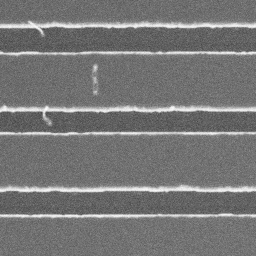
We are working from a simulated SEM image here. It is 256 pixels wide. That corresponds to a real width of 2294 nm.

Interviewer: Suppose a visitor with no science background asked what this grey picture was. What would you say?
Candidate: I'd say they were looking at lines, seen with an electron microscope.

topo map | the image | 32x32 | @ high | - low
@@@@@@@@@@@@@@@@@@@@@@@@@@@@@@@@
@@@@@@@@@@@@@@@@@@@@@@@@@@@@@@@@
@@@@@@@@@@@@@@@@@@@@@@@@@@@@@@@@
----@---------------------------
--------------------------------
--------------------------------
--------------------------------
@@@@@@@@@@@@@@@@@@@@@@@@@@@@@@@@
@@@@@@@@@@@@@@@@@@@@@@@@@@@@@@@@
@@@@@@@@@@@@@@@@@@@@@@@@@@@@@@@@
@@@@@@@@@@@@@@@@@@@@@@@@@@@@@@@@
@@@@@@@@@@@@@@@@@@@@@@@@@@@@@@@@
@@@@@@@@@@@@@@@@@@@@@@@@@@@@@@@@
@@@@@@@@@@@@@@@@@@@@@@@@@@@@@@@@
--------------------------------
--------------------------------
--------------------------------
@@@@@@@@@@@@@@@@@@@@@@@@@@@@@@@@
@@@@@@@@@@@@@@@@@@@@@@@@@@@@@@@@
@@@@@@@@@@@@@@@@@@@@@@@@@@@@@@@@
@@@@@@@@@@@@@@@@@@@@@@@@@@@@@@@@
@@@@@@@@@@@@@@@@@@@@@@@@@@@@@@@@
@@@@@@@@@@@@@@@@@@@@@@@@@@@@@@@@
@@@@@@@@@@@@@@@@@@@@@@@@@@@@@@@@
--------------------------------
--------------------------------
--------------------------------
@@@@@@@@@@@@@@@@@@@@@@@@@@@@@@@@
@@@@@@@@@@@@@@@@@@@@@@@@@@@@@@@@
@@@@@@@@@@@@@@@@@@@@@@@@@@@@@@@@
@@@@@@@@@@@@@@@@@@@@@@@@@@@@@@@@
@@@@@@@@@@@@@@@@@@@@@@@@@@@@@@@@